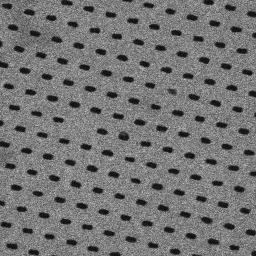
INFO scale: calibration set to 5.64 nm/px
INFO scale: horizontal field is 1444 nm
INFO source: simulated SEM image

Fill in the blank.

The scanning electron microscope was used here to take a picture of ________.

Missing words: a regular array of holes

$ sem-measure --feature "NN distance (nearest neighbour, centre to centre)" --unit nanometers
124